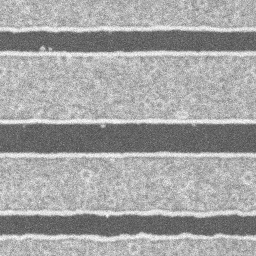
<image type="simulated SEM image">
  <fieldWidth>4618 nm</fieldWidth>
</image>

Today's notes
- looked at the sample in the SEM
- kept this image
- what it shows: one or a few lines or trenches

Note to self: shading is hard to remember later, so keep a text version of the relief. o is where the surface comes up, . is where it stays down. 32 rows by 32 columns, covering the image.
oooooooooooooooooooooooooooooooo
oooooooooooooooooooooooooooooooo
oooooooooooooooooooooooooooooooo
ooooo.oooooo.oooooo......ooooooo
................................
................................
................................
oooooooooooooooooooooooooooooooo
oooooooooooooooooooooooooooooooo
oooooooooooooooooooooooooooooooo
oooooooooooooooooooooooooooooooo
oooooooooooooooooooooooooooooooo
oooooooooooooooooooooooooooooooo
oooooooooooooooooooooooooooooooo
oooooooooooooooooooooooooooooooo
................................
................................
................................
................................
oooooooooooooooooooooooooooooooo
oooooooooooooooooooooooooooooooo
oooooooooooooooooooooooooooooooo
oooooooooooooooooooooooooooooooo
oooooooooooooooooooooooooooooooo
oooooooooooooooooooooooooooooooo
oooooooooooooooooooooooooooooooo
ooooooooo..ooooooooooooooooooooo
................................
................................
.................oo....o...o....
oooooooooooooooooooooooooooooooo
oooooooooooooooooooooooooooooooo